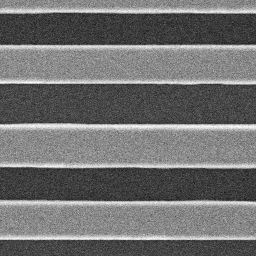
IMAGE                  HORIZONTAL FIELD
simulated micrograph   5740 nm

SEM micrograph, lines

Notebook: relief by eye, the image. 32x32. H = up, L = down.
HHHHHHHHHHHHHHHHHHHHHHHHHHHHHHHH
HHHHHLLLLLLHLHHHHHHHHHHHHHHHHHHH
LLLLLLLLLLLLLLLLLLLLLLLLLLLLLLLL
LLLLLLLLLLLLLLLLLLLLLLLLLLLLLLLL
LLLLLLLLLLLLLLLLLLLLLLLLLLLLLLLL
LLLLLLLLLLLLLLLLLLLLLLLLLLLLLLLL
HHHHHHHHHHHHHHHHHHHHHHHHHHHHHHHH
HHHHHHHHHHHHHHHHHHHHHHHHHHHHHHHH
HHHHHHHHHHHHHHHHHHHHHHHHHHHHHHHH
HHHHHHHHHHHHHHHHHHHHHHHHHHHHHHHH
LLLLLLLLLLLLLLLLLLLLLLLLLLLLLLLL
LLLLLLLLLLLLLLLLLLLLLLLLLLLLLLLL
LLLLLLLLLLLLLLLLLLLLLLLLLLLLLLLL
LLLLLLLLLLLLLLLLLLLLLLLLLLLLLLLL
LLLLLLLLLLLLLLLLLLLLLLLLLLLLLLLL
LLLLLLLLLLLLLLLLLLLLLLLLLLLLLLLL
HHHHHHHHHHHHHHHHHHHHHHHHHHHHHHHH
HHHHHHHHHHHHHHHHHHHHHHHHHHHHHHHH
HHHHHHHHHHHHHHHHHHHHHHHHHHHHHHHH
HHHHHHHHHHHHHHHHHHHHHHHHHHHHHHHH
HHHHHHHHHHHHHHHHHHHHHHHHHHHHHHHH
LLLLLLLLLLLLLLLLLLLLLLLLLLLLLLLL
LLLLLLLLLLLLLLLLLLLLLLLLLLLLLLLL
LLLLLLLLLLLLLLLLLLLLLLLLLLLLLLLL
LLLLLLLLLLLLLLLLLLLLLLLLLLLLLLLL
HHHHHHHHHHHHHHHHHHHHHHHHHHHHHHHH
HHHHHHHHHHHHHHHHHHHHHHHHHHHHHHHH
HHHHHHHHHHHHHHHHHHHHHHHHHHHHHHHH
HHHHHHHHHHHHHHHHHHHHHHHHHHHHHHHH
HHHHHHHHHHHHHHHHHHHHHHHHHHHHHHHH
LLLLLLLLLLLLLLLLLLLLLLLLLLLLLLLL
LLLLLLLLLLLLLLLLLLLLLLLLLLLLLLLL